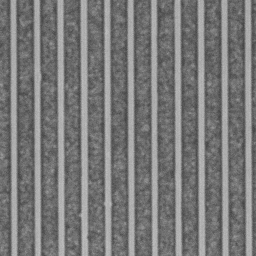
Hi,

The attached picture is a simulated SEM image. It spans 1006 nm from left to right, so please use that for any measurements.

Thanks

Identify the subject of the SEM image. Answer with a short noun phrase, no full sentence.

parallel lines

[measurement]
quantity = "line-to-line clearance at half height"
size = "73.3 nm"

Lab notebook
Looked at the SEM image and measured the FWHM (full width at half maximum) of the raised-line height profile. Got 0.0197 micrometres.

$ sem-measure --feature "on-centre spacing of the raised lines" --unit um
0.0923